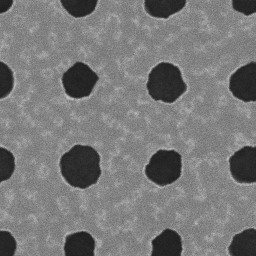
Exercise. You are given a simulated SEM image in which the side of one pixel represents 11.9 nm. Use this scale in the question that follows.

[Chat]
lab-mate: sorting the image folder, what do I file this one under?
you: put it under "holes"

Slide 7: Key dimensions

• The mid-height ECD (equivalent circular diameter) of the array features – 0.449 microns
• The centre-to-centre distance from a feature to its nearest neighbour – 995 nm